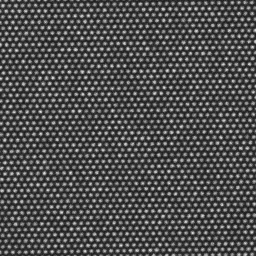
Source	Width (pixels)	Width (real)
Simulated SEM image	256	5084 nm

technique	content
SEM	a regular array of raised bodies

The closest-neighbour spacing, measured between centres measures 123 nanometers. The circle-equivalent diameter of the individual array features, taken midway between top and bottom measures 67.2 nanometres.